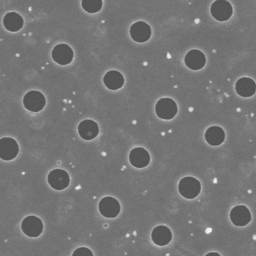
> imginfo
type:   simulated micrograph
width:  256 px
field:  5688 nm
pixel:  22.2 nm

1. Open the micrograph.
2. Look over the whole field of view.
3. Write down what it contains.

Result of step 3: a regular array of holes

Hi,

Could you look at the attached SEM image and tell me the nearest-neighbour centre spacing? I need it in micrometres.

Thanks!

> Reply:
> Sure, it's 1.24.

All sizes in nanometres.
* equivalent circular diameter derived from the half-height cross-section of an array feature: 481